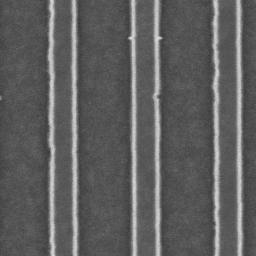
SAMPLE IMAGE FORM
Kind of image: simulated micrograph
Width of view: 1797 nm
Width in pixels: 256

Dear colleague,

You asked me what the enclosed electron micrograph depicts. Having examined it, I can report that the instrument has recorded one or a few lines or trenches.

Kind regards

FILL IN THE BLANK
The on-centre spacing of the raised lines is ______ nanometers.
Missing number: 578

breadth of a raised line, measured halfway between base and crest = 164 nanometres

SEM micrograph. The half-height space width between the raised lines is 58.9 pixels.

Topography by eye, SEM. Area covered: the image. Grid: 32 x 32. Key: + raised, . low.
......+++........+++.......+++..
.......++........+++.......+++..
......+++........+++.......+++..
......+++........+++.......+++..
......+++........+++.......+++..
......+++........+++.......+++..
......+++........+++.......+++..
......+++........+++.......+++..
......+++........+++.......+++..
......+++........+++.......+++..
......+++........+++.......+++..
......+++........+++.......+++..
......+++........+++.......+++..
......+++........+++.......+++..
......+++........+++.......+++..
......+++........+++.......+++..
......+++........+++.......+++..
......+++........+++.......+++..
......+++........+++.......+++..
.......++........+++.......+++..
......+++........+++.......+++..
......+++........+++.......+++..
.......++........+++.......+++..
.......++........+++.......+++..
.......++........+++.......+++..
.......++........+++.......+++..
.......++........+++.......+++..
.......++........+++.......+++..
.......++........+++.......+++..
.......++........+++.......+++..
.......++........+++.......+++..
.......++........+++.......+++..